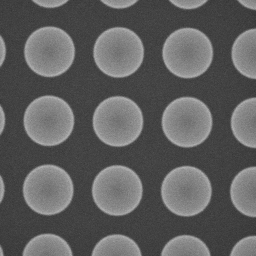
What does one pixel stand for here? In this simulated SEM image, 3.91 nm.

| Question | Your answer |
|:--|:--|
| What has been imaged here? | an array of small figures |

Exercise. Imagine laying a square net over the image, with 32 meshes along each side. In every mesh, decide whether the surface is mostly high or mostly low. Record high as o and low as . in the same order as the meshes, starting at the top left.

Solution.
.....ooo.....oooo.....ooo.....oo
................................
................................
.....oo.........................
....ooooo....oooo....ooooo....oo
o..oooooo...oooooo...ooooo...ooo
o..oooooo...oooooo..ooooooo..ooo
...oooooo...oooooo..oooooo...ooo
....ooooo...ooooo....ooooo....oo
.....oo.......oo......ooo......o
................................
................................
....oooo.....ooo......ooo......o
...oooooo...ooooo....ooooo....oo
o..oooooo...oooooo..oooooo...ooo
o..oooooo...oooooo..oooooo...ooo
...oooooo...oooooo...ooooo...ooo
....oooo.....oooo....ooooo....oo
................................
................................
................................
....oooo.....oooo....oooo.....oo
...oooooo...ooooo....ooooo...ooo
...oooooo...oooooo..oooooo...ooo
...oooooo...oooooo..oooooo...ooo
...oooooo...ooooo....ooooo...ooo
.....oo......ooo......ooo.....oo
................................
................................
.....oo.......oo.......o........
...ooooo....ooooo....ooooo....oo
...oooooo...oooooo..oooooo...ooo